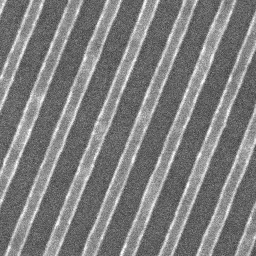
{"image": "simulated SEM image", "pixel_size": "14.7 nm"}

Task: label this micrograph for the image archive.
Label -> parallel lines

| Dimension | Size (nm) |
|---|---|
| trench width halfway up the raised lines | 337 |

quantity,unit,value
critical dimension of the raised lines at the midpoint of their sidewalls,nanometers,181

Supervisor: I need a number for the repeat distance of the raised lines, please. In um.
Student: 0.524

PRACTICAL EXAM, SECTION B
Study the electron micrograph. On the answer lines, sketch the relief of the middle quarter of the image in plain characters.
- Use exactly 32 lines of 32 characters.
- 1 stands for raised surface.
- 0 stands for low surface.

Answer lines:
00001111000000111000000111100000
00001110000000111000000111100000
00011110000001110000000111000000
00011100000001110000001111000000
00011100000011100000001110000001
00111100000011100000011110000001
00111000000011100000011100000001
00111000000111000000011100000011
01110000000111000000111100000011
01110000001110000000111000000011
11110000001110000001111000000111
11100000001110000001110000000111
11100000011100000001110000001111
11100000011100000011110000001110
11000000111100000011100000001110
11000000111000000011100000011100
10000001111000000111000000011100
10000001110000000111000000111100
00000001110000001111000000111000
00000011110000001110000001111000
00000011100000001110000001110000
00000011100000011100000001110000
00000111000000011100000011110000
00000111000000111100000011100000
00001111000000111000000011100000
00001110000000111000000111000000
00001110000001110000000111000000
00011110000001110000001111000000
00011100000011110000001110000001
00111100000011100000011110000001
00111000000011100000011100000001
01111000000111100000011100000011